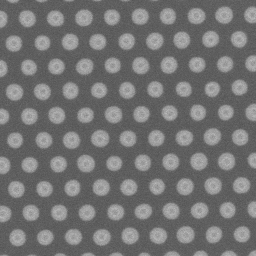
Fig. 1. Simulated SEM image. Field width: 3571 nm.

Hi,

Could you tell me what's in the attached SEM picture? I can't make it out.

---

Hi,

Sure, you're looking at an array of small figures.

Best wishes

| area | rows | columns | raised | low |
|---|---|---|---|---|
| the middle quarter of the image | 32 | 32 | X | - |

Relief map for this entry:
---XXXX---XXXX---XXXX---XXXX---X
---XXXX----XXX---XXXX----XXX----
----XX--------------------------
--------------------------------
----------------------X---------
XXX----XXX----XXX----XXXX---XXXX
XXXX---XXXX---XXXX---XXXX---XXXX
XXX----XXX----XXXX---XXX-----XXX
-X-------------XX---------------
--------------------------------
--------------------------X-----
----XXX----XXX----XXX----XXX----
---XXXX---XXXX---XXXX----XXX----
---XXXX---XXXX----XXX----XXX----
-----X-----XX-------------------
--------------------------------
--------------------------------
XXX----XXXX---XXXX---XXXX---XXXX
XXXX---XXXX---XXXX---XXXX---XXXX
XXXX---XXXX---XXXX---XXXX---XXXX
XXX-----XX-----XX---------------
--------------------------------
--------------------------------
----XXX----XXX----XXX----XXX----
X--XXXXX---XXX----XXXX---XXXX---
X--XXXXX---XXX----XXX----XXXX---
----XXX-----X------XX-----------
--------------------------------
--------------------------------
-XX-----XXX----XXX----XXX----XXX
XXXX---XXXX---XXXX---XXXX---XXXX
XXXX---XXXX---XXXX----XXX---XXXX